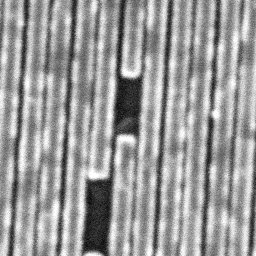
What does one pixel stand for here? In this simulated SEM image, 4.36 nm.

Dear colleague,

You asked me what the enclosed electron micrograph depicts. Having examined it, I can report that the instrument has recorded parallel lines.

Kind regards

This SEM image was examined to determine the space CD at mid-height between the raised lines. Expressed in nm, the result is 27.7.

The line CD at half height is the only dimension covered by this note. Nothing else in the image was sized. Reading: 79.3 nanometres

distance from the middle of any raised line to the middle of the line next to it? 104 nanometers